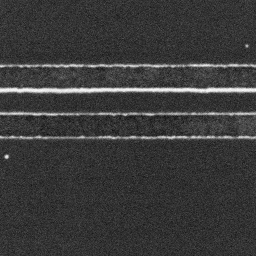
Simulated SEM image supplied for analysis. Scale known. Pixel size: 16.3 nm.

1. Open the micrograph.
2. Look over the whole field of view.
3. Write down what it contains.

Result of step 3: lines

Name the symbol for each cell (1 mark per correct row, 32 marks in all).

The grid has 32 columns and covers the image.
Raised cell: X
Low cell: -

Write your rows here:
XXXXXXXXXXXXXXXXXXXXXXXXXXXXXXXX
XXXXXXXXXXXXXXXXXXXXXXXXXXXXXXXX
XXXXXXXXXXXXXXXXXXXXXXXXXXXXXXXX
XXXXXXXXXXXXXXXXXXXXXXXXXXXXXXXX
XXXXXXXXXXXXXXXXXXXXXXXXXXXXXXXX
XXXXXXXXXXXXXXXXXXXXXXXXXXXXXXXX
XXXXXXXXXXXXXXXXXXXXXXXXXXXXXXXX
XXXXXXXXXXXXXXXXXXXXXXXXXXXXXXXX
--------------------------------
--------------------------------
--------------------------------
XXXXXXXXXXXXXXXXXXXXXXXXXXXXXXXX
XXXXXXXXXXXXXXXXXXXXXXXXXXXXXXXX
XXXXXXXXXXXXXXXXXXXXXXXXXXXXXXXX
--------------------------------
--------------------------------
--------------------------------
XXXXXXXXXXXXXXXXXXXXXXXXXXXXXXXX
XXXXXXXXXXXXXXXXXXXXXXXXXXXXXXXX
XXXXXXXXXXXXXXXXXXXXXXXXXXXXXXXX
XXXXXXXXXXXXXXXXXXXXXXXXXXXXXXXX
XXXXXXXXXXXXXXXXXXXXXXXXXXXXXXXX
XXXXXXXXXXXXXXXXXXXXXXXXXXXXXXXX
XXXXXXXXXXXXXXXXXXXXXXXXXXXXXXXX
XXXXXXXXXXXXXXXXXXXXXXXXXXXXXXXX
XXXXXXXXXXXXXXXXXXXXXXXXXXXXXXXX
XXXXXXXXXXXXXXXXXXXXXXXXXXXXXXXX
XXXXXXXXXXXXXXXXXXXXXXXXXXXXXXXX
XXXXXXXXXXXXXXXXXXXXXXXXXXXXXXXX
XXXXXXXXXXXXXXXXXXXXXXXXXXXXXXXX
XXXXXXXXXXXXXXXXXXXXXXXXXXXXXXXX
XXXXXXXXXXXXXXXXXXXXXXXXXXXXXXXX